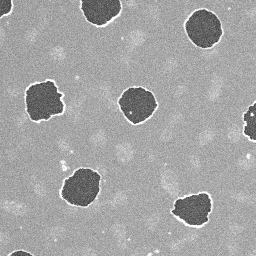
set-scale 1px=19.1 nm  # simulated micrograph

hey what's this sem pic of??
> holes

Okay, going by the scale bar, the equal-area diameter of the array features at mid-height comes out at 712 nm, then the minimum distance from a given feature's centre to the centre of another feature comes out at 1810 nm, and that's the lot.